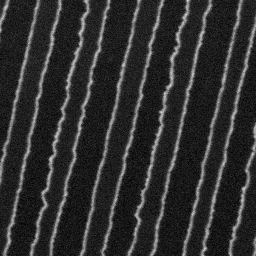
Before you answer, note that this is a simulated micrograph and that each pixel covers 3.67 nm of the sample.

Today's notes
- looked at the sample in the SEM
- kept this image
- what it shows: lines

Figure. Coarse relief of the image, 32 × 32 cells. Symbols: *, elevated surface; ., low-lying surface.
*....***...***...***...***....**
*...***....**....***...***....**
....***...***....***...***....**
....***...***...****...***...***
....***...***...***...***....***
....***...***...***...***....**.
...***....**....***...***....**.
...***...***...****..****...***.
...***...***...***...***....***.
...**....***...***...***....**..
..***...***....***...***....**..
..***...***....***...***...***..
..***...***....***..****...***..
..***...***...***...***....***..
..**....**....***...***....**...
.***...***....***...***...***...
.***...***....***...***...***...
.***...***...***...***....***...
.***...**....***...***....**....
***...***....***...***....**...*
***...***....***...***...***...*
***...***...***....**....***...*
***...**....***...***....**....*
***...**....***...***....**....*
**...***....***...***....**...**
**...***....**....**....***...**
**...***...***...***....***...**
**...**....***...***....**....**
*....**....***...***....**...***
*...***....***...***...***...***
*...***...***....***...***...***
*...**....***...***....***...***